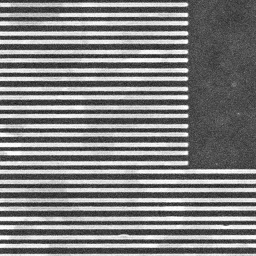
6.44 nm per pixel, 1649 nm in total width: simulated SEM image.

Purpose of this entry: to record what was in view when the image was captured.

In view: parallel lines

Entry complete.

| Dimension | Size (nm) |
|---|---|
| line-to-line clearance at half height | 46.7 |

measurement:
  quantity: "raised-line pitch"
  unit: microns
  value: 0.0597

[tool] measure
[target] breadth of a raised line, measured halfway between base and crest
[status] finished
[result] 0.0177 micrometres